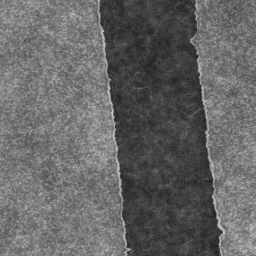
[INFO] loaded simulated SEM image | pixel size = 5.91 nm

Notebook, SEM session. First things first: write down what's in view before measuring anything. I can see one or a few lines or trenches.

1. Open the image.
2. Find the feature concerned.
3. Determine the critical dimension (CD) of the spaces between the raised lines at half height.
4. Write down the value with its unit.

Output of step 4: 547 nm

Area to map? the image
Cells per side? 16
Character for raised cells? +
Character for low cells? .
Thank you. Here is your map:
++++++......++++
++++++......++++
++++++......++++
+++++++.....++++
+++++++.....++++
+++++++......+++
+++++++......+++
+++++++......+++
+++++++......+++
+++++++......+++
+++++++......+++
++++++++.....+++
++++++++.....+++
++++++++......++
++++++++......++
++++++++......++